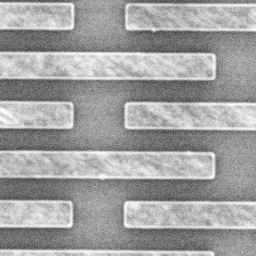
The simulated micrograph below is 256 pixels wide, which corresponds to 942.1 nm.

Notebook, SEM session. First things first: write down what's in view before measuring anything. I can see groups of lines, slits or small figures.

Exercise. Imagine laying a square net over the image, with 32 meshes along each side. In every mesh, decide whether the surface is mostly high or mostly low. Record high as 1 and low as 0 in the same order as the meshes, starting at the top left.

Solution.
00000000000000000000000000000000
11111111100000001111111111111111
11111111100000001111111111111111
00000011100000001111111111111111
00000000000000000000000000000000
00000000000000000000000000000000
00000000000000000000000000000000
11111111111111111111111111100000
11111111111111111111111111100000
11111111111111111111111111100000
00000000000000000000000000000000
00000000000000000000000000000000
00000000000000000000000000000000
11111111100000001111111111111111
11111111100000001111111111111111
11111111100000001111111111111111
00000000000000000000000000000000
00000000000000000000000000000000
00000000000000000000000000000000
11111111111111111111111111100000
11111111111111111111111111100000
11111111111111111111111111100000
00000000000000000000000000000000
00000000000000000000000000000000
00000000000000000000000000000000
11111111100000001111111111111111
11111111100000001111111111111111
11111111100000001111111111111111
00000000000000000000000000000000
00000000000000000000000000000000
00000000000000000000000000000000
11111111111000000000000000000000